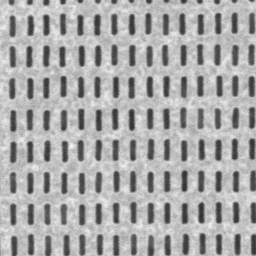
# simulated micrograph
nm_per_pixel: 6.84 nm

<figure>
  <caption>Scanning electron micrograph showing a regular array of holes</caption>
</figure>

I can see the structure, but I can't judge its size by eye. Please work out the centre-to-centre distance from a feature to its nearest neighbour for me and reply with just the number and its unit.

16.6 px